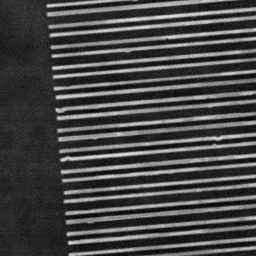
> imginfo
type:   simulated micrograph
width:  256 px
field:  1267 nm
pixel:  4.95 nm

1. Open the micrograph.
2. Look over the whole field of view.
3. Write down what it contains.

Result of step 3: parallel lines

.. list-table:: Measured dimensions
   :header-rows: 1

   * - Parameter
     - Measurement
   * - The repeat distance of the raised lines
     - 10.4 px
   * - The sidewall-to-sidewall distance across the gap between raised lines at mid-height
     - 29.5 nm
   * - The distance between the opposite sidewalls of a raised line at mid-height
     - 14.8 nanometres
